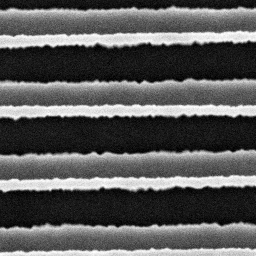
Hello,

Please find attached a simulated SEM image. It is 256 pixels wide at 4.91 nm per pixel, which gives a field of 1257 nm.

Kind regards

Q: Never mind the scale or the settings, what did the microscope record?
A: lines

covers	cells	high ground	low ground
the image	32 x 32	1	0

00000000000000000000000000000000
11111111111111111111111111111111
11111111111111111111111111111111
11111111111111111111111111111111
11111111111111111111111111111111
11111111111101111000000000000000
00000000000000000000000000000000
00000000000000000000000000000000
00000000000000000000000000000000
00000000000000000000000000000000
11111111111111111111111111111111
11111111111111111111111111111111
11111111111111111111111111111111
11111111111111111111111111111111
11111000000101000000000000000000
00000000000000000000000000000000
00000000000000000000000000000000
00000000000000000000000000000000
00000000000000000000000000000000
01011111111111111111111111111111
11111111111111111111111111111111
11111111111111111111111111111111
11111111111111111111111111111111
11111111111100011011100000000000
00000000000000000000000000000000
00000000000000000000000000000000
00000000000000000000000000000000
00000000000000000000000000000000
00001111111111111111111111111111
11111111111111111111111111111111
11111111111111111111111111111111
11111111111111111111111111111111